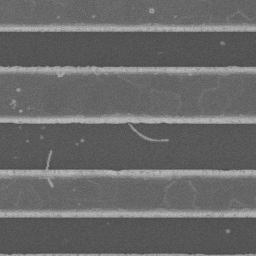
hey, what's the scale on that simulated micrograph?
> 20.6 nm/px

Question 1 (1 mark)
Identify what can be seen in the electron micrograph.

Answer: lines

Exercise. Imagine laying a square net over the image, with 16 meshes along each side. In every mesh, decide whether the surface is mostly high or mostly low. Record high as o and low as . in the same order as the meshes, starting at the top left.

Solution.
oooooooooooooooo
oooooooooooooooo
................
................
oooooooooooooooo
oooooooooooooooo
oooooooooooooooo
oooooooooooooooo
................
................
................
oooooooooooooooo
oooooooooooooooo
................
................
................